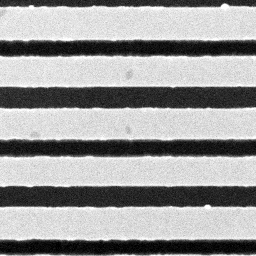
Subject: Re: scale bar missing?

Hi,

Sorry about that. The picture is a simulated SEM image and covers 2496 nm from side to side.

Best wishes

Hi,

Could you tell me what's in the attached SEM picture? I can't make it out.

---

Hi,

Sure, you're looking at lines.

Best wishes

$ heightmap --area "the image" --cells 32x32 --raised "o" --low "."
................................
oooooooooooooooooooooooooooooooo
oooooooooooooooooooooooooooooooo
oooooooooooooooooooooooooooooooo
oooooooooooooooooooooooooooooooo
................................
................................
oooooooooooooooooooooooooooooooo
oooooooooooooooooooooooooooooooo
oooooooooooooooooooooooooooooooo
oooooooooooooooooooooooooooooooo
................................
................................
................................
oooooooooooooooooooooooooooooooo
oooooooooooooooooooooooooooooooo
oooooooooooooooooooooooooooooooo
................................
................................
................................
oooooooooooooooooooooooooooooooo
oooooooooooooooooooooooooooooooo
oooooooooooooooooooooooooooooooo
................................
................................
................................
oooooooooooooooooooooooooooooooo
oooooooooooooooooooooooooooooooo
oooooooooooooooooooooooooooooooo
oooooooooooooooooooooooooooooooo
................................
................................